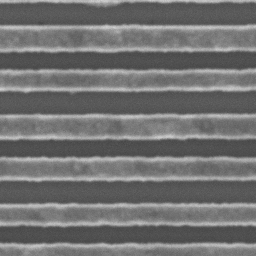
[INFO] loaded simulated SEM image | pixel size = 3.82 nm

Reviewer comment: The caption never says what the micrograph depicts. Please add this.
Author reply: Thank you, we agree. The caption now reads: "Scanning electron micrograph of lines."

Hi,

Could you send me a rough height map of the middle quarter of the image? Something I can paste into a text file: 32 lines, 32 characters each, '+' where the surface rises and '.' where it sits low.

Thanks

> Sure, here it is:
................................
..........+.+...........+.......
++++++++++++++++++++++++++++++++
++++++++++++++++++++++++++++++++
++++++++++++++++++++++++++++++++
++++++++++++++++++++++++++++++++
.++.+..++..+++++++++..+.........
................................
................................
................................
................................
................................
................................
++++++++++++++++++++++++++++++++
++++++++++++++++++++++++++++++++
++++++++++++++++++++++++++++++++
++++++++++++++++++++++++++++++++
++++++++++++++++++++++++++++++++
++++++++++++++++++++++++++.++++.
................................
................................
................................
................................
................................
++++++++++++++++++++++++++++++++
++++++++++++++++++++++++++++++++
++++++++++++++++++++++++++++++++
++++++++++++++++++++++++++++++++
++++++++++++++++++++++++++++++++
................................
................................
................................